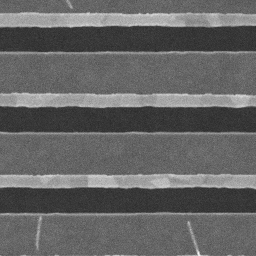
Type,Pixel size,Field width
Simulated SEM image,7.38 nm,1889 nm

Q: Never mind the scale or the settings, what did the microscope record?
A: lines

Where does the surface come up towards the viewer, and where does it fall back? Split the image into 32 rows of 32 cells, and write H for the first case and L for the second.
HHHHHHHHHHHHHHHHHHHHHHHHHHHHHHHH
HHHHHHHHHHHHHHHHHHHHHHHHHHHHHHHH
HHHHHHHHHHHHHHHHHHHHHHHHHHHHHHHH
LLLLLLLLLLLLLLLLLLLLLLLLLLLLLLLL
LLLLLLLLLLLLLLLLLLLLLLLLLLLLLLLL
LLLLLLLLLLLLLLLLLLLLLLLLLLLLLLLL
LLLLLLLLLLLLLHLLLLLLLHHHHHHHHHHH
HHHHHHHHHHHHHHHHHHHHHHHHHHHHHHHH
HHHHHHHHHHHHHHHHHHHHHHHHHHHHHHHH
HHHHHHHHHHHHHHHHHHHHHHHHHHHHHHHH
HHHHHHHHHHHHHHHHHHHHHHHHHHHHHHHH
HHHHHHHHHHHHHHHHHHHHHHHHHHHHHHHH
HHHHHHHHHHHHHHHHHHHHHHHHHHHHHHHH
LLLLLLLLLLLLLLLLLLLLLLLLLLLLLLLL
LLLLLLLLLLLLLLLLLLLLLLLLLLLLLLLL
LLLLLLLLLLLLLLLLLLLLLLLLLLLLLLLL
LLLLLLLLLLLLLLLLLLLLLLLLLLLLLLLL
HHHHHHHHHHHHHHHHHHHHHHHHHHHHHHHH
HHHHHHHHHHHHHHHHHHHHHHHHHHHHHHHH
HHHHHHHHHHHHHHHHHHHHHHHHHHHHHHHH
HHHHHHHHHHHHHHHHHHHHHHHHHHHHHHHH
HHHHHHHHHHHHHHHHHHHHHHHHHHHHHHHH
HHHHHHHHHHHHHHHHHHHHHHHHHHHHHHHH
LLLLLLLLLLLLLLLLLLHLLLLLLLLLLLLL
LLLLLLLLLLLLLLLLLLLLLLLLLLLLLLLL
LLLLLLLLLLLLLLLLLLLLLLLLLLLLLLLL
LLLLLLLLLLLLLLLLLLLLLLLLLLLLLLLL
HHHHHHHHHHHHHHHHHHHHHHHHHHHHHHHH
HHHHHHHHHHHHHHHHHHHHHHHHHHHHHHHH
HHHHHHHHHHHHHHHHHHHHHHHHHHHHHHHH
HHHHHHHHHHHHHHHHHHHHHHHHHHHHHHHH
HHHHHHHHHHHHHHHHHHHHHHHHHHHHHHHH